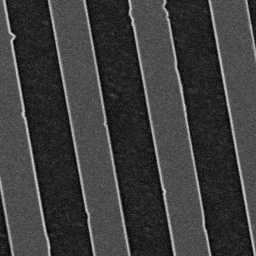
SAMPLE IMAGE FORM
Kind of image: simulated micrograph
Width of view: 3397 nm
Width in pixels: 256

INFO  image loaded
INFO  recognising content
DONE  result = one or a few lines or trenches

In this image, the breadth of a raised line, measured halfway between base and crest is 474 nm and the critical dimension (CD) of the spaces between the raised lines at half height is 585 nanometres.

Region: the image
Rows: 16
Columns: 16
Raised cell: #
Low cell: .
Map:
...##...##...##.
#..###..###..###
#..###..###...##
#...##...##...##
#...##...##...##
#...##...##...##
#...##...##...##
##..###..###..##
##...##...##...#
##...##...##...#
##...##...##...#
##...##...##...#
##...##...###..#
###...##...##...
.##...##...##...
.##...##...##...